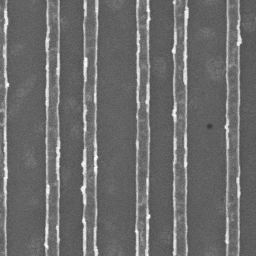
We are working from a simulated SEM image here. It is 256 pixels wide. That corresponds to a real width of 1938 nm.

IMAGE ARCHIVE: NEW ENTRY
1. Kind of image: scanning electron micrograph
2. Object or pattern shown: parallel lines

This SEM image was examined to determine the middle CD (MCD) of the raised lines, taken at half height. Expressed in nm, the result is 95.5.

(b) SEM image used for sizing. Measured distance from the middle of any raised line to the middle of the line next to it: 341 nanometers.